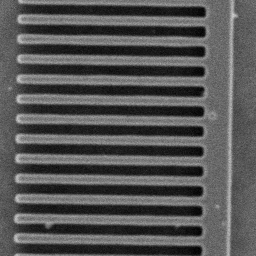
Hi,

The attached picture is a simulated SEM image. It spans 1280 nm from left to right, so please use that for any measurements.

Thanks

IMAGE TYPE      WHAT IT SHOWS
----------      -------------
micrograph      groups of lines, slits or small figures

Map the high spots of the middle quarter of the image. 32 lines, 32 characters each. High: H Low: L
LLLLLLLLLLLLLLLLLLLLLLLLLLLLLLLL
LLLLLLLLLLLLLLLLLLLLLLLLLLLLLLLL
LLLLLLLLLLLLLLLLLLLLLLLLLLLLLLLL
HHHHHHHHHHHHHHHHHHHHHHHHHHHHHHHH
HHHHHHHHHHHHHHHHHHHHHHHHHHHHHHHH
LLLLLLLLLLLLLLLLLLLLLLLLLLLLLLLL
LLLLLLLLLLLLLLLLLLLLLLLLLLLLLLLL
LLLLLLLLLLLLLLLLLLLLLLLLLLLLLLLL
HHHHHHHHHHHHHHHHHHHHHHHHHHHHHHHH
HHHHHHHHHHHHHHHHHHHHHHHHHHHHHHHH
LLLLLLLLLLLLLLLLLLLLLLLLLLLLLLLL
LLLLLLLLLLLLLLLLLLLLLLLLLLLLLLLL
LLLLLLLLLLLLLLLLLLLLLLLLLLLLLLLL
HHHHHHHHHHHHHHHHHHHHHHHHHHHHHHHH
HHHHHHHHHHHHHHHHHHHHHHHHHHHHHHHH
LLLLLLLLLLLLLLLLLLLLLLLLLLLLLLLL
LLLLLLLLLLLLLLLLLLLLLLLLLLLLLLLL
LLLLLLLLLLLLLLLLLLLLLLLLLLLLLLLL
HHHHHHHHHHHHHHHHHHHHHHHHHHHHHHHH
HHHHHHHHHHHHHHHHHHHHHHHHHHHHHHHH
LLLLLLLLLLLLLLLLLLLLLLLLLLLLLLLL
LLLLLLLLLLLLLLLLLLLLLLLLLLLLLLLL
LLLLLLLLLLLLLLLLLLLLLLLLLLLLLLLL
HHHHHHHHHHHHHHHHHHHHHHHHHHHHHHHH
HHHHHHHHHHHHHHHHHHHHHHHHHHHHHHHH
LLLLLLLLLLLLLLLLLLLLLLLLLLLLLLLL
LLLLLLLLLLLLLLLLLLLLLLLLLLLLLLLL
LLLLLLLLLLLLLLLLLLLLLLLLLLLLLLLL
HHHHHHHHHHHHHHHHHHHHHHHHHHHHHHHH
HHHHHHHHHHHHHHHHHHHHHHHHHHHHHHHH
LLLLLLLLLLLLLLLLLLLLLLLLLLLLLLLL
LLLLLLLLLLLLLLLLLLLLLLLLLLLLLLLL